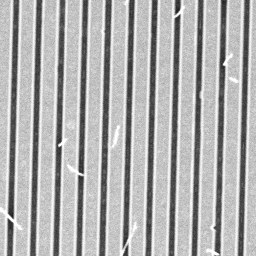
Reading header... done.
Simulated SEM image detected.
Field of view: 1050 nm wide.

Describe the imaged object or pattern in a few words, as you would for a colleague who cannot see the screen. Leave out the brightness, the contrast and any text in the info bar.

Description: parallel lines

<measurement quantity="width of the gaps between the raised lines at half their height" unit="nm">32.3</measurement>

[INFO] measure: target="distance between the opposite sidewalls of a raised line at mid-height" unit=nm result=64.6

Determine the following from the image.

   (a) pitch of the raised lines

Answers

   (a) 94.6 nm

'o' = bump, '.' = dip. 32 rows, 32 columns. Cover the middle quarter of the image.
oooo..oooo..oooo..ooo..oooo..ooo
oooo..oooo..oooo.oooo..oooo..ooo
oooo..oooo..oooo.oooo..oooo..ooo
oooo..oooo..ooo..oooo..oooo..ooo
oooo..oooo..ooo..oooo..oooo..ooo
oooo..oooo..ooo..oooo..oooo..ooo
oooo..oooo..ooo..oooo..oooo..ooo
oooo..ooo...ooo..oooo..oooo..ooo
oooo..ooo...ooo..oooo..oooo..ooo
oooo..ooo...ooo..oooo..oooo..ooo
oooo..ooo...ooo..oooo..oooo..ooo
oooo..ooo...ooo..oooo..oooo..ooo
oooo..ooo...ooo..oooo..oooo..ooo
oooo..ooo...ooo..oooo..oooo..ooo
oooo..ooo...ooo..oooo..oooo..ooo
oooo..ooo..oooo..oooo..oooo..ooo
oooo..ooo..oooo..oooo..ooo...ooo
oooo..ooo..oooo..oooo..ooo...ooo
oooo.oooo..oooo..oooo..ooo...ooo
oooo.oooo..oooo..oooo..ooo...ooo
ooo..oooo..oooo..oooo..ooo...ooo
ooo..oooo..oooo..oooo..ooo...ooo
ooo..oooo..oooo..oooo..ooo...ooo
ooo..oooo..oooo..oooo..ooo...ooo
ooo..oooo..oooo..oooo..ooo..oooo
ooo..oooo..oooo..oooo..ooo..oooo
ooo..oooo..oooo..oooo..ooo..oooo
oooo.oooo..oooo..oooo..ooo..oooo
ooo..oooo..oooo..oooo..ooo..oooo
ooo..oooo..oooo..ooo...ooo..oooo
ooo..oooo..oooo..ooo...ooo..oooo
ooo..oooo..oooo..ooo..oooo..oooo